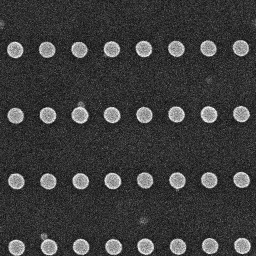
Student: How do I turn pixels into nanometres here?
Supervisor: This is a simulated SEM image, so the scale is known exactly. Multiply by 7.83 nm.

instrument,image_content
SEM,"a regular array of raised bodies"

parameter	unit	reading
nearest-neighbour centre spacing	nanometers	251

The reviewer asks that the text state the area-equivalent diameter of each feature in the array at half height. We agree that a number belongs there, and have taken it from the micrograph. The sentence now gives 122 nm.